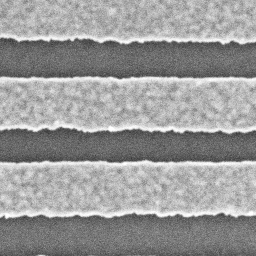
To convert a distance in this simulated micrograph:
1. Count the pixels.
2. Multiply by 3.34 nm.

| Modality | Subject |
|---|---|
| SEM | lines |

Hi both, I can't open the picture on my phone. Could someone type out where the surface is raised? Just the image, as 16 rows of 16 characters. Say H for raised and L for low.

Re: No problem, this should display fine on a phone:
HHHHHHHHHHHHHHHH
HHHHHHHHHHHHHHHH
LLLLLLHHHHHHHHHH
LLLLLLLLLLLLLLLL
LLLLLLLLLLLLLLLL
HHHHHHHHHHHHHHHH
HHHHHHHHHHHHHHHH
HHHHHHHHHHHHHHHH
LLLLLLLLLLLLLLLL
LLLLLLLLLLLLLLLL
HHHHHHHHHHHHHHHH
HHHHHHHHHHHHHHHH
HHHHHHHHHHHHHHHH
HHLHLLHLLLLLLLLL
LLLLLLLLLLLLLLLL
LLLLLLLLLLLLLLLL